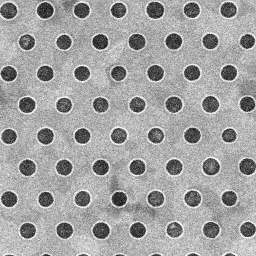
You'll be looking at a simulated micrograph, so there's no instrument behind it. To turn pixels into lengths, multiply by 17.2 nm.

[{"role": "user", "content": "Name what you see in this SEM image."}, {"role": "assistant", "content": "a regular array of holes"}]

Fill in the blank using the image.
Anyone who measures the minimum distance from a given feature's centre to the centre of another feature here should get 621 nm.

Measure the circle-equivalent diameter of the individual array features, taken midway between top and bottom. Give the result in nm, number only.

287